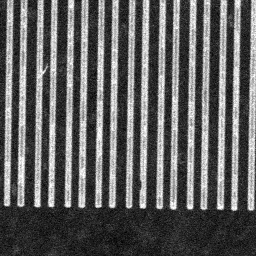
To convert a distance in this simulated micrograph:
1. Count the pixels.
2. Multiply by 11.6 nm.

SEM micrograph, parallel lines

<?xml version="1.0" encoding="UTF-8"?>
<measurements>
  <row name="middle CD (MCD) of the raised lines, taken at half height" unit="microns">0.0582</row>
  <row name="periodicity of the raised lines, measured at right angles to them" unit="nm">177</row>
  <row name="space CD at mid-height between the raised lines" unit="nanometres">118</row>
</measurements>